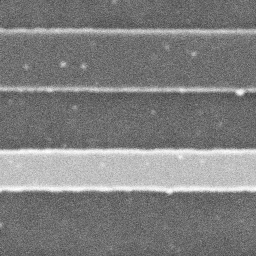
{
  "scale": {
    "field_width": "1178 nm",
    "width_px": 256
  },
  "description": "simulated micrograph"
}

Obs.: lines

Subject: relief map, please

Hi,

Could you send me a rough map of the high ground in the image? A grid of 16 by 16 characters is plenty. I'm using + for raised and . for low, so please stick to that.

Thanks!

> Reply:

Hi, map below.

................
................
++++++++++++++++
++++++++++++++++
++++++++++++++++
++++++++++++++++
................
................
................
++++++++++++++++
++++++++++++++++
++++++++++++++++
................
................
................
................